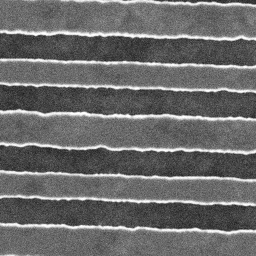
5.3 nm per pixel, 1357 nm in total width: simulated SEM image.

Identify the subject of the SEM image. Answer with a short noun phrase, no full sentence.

lines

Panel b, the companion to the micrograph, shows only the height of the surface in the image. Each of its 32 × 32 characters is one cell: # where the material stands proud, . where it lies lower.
###############################.
################################
################################
################################
...........#.#.#################
................................
................................
######..........................
################################
################################
################################
.............................###
................................
................................
######################..........
################################
################################
################################
.......#####.###################
................................
................................
##.#............................
##############################..
################################
################################
.........................#######
................................
................................
################.##.............
################################
################################
################################